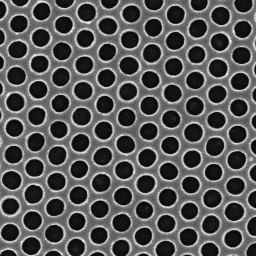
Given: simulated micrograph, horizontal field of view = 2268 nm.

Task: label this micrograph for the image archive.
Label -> a regular array of holes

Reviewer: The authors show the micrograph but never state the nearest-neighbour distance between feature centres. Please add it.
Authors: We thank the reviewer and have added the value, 226 nanometers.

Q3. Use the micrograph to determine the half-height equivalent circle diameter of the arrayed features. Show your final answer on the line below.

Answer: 161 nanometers